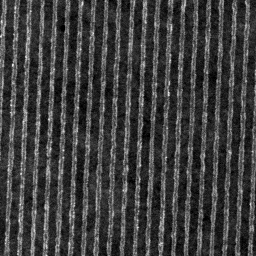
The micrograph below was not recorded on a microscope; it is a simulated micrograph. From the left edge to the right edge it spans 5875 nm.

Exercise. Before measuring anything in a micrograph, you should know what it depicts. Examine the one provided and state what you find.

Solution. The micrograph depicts parallel lines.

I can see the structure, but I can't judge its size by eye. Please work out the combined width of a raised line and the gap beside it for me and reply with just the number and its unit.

0.294 µm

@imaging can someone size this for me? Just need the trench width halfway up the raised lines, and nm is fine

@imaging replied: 215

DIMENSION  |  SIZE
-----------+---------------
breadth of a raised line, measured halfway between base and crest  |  80.2 nanometres